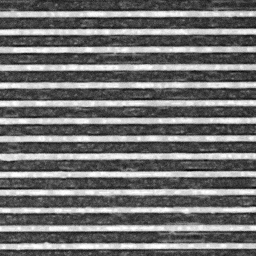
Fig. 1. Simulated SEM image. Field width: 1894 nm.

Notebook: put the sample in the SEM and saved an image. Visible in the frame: parallel lines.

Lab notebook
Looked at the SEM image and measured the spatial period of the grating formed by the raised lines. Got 17.9 pixels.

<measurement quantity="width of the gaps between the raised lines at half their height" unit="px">11.9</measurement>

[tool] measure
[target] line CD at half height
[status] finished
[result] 43.5 nanometres